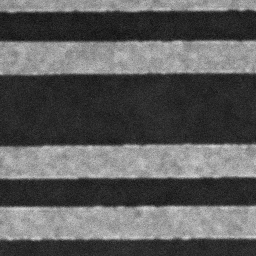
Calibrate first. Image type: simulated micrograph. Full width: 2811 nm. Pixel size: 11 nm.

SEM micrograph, lines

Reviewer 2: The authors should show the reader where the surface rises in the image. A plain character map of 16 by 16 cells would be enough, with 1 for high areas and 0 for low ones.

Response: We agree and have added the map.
1111111111111111
0000000000000000
0000000000000000
1111111111111111
1111111111111111
0000000000000000
0000000000000000
0000000000000000
0000000000000000
1111111111111111
1111111111111111
0000000000000000
0000000000000000
1111111111111111
1111111111111111
0000000000000000